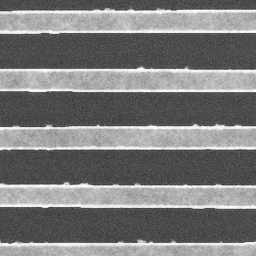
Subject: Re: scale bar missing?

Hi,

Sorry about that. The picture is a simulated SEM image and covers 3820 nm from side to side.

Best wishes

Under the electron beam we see lines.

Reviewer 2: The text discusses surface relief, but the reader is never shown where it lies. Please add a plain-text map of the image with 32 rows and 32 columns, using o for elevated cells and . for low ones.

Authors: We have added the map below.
................................
...o.ooooooooooooooooooooooooooo
oooooooooooooooooooooooooooooooo
oooooooooooooooooooooooooooooooo
................................
................................
................................
................................
................................
oooooooooooooooooooooooooooooooo
oooooooooooooooooooooooooooooooo
................................
................................
................................
................................
................................
oooooooooooooooooooooooooooooooo
oooooooooooooooooooooooooooooooo
ooooooooooooooooooooooooooooooo.
................................
................................
................................
................................
oooooooooooooooooooooooooooooooo
oooooooooooooooooooooooooooooooo
oooooooooooooooooooooooooooooooo
................................
................................
................................
................................
.......ooo.ooooooooooooooooooooo
oooooooooooooooooooooooooooooooo